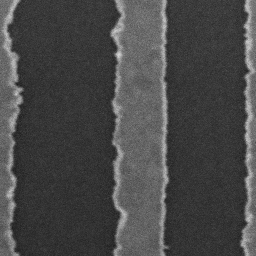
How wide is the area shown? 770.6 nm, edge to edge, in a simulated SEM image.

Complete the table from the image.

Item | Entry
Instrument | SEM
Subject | one or a few lines or trenches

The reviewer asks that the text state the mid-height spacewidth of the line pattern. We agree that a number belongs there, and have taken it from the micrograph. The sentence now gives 0.266 micrometres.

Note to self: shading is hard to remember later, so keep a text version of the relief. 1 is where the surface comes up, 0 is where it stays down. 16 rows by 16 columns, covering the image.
1000000111000001
0000000111000001
0000000111000001
1000000111000001
1000000111000000
1000000111000001
1000000111000001
1000000111000001
1000000111000001
1000000111000000
1000000111000000
1000000111000001
1000000111000000
1000000011000001
1000000111000001
1000000111000001